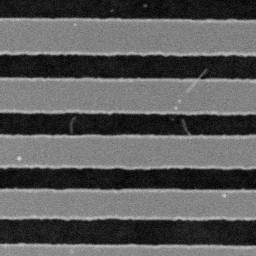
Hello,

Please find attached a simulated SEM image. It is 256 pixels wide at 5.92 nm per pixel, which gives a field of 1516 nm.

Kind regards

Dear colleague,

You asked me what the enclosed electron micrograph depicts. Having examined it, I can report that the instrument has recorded lines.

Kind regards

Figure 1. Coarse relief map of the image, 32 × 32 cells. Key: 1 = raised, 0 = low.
00000000000000000000000000000000
00000000000000000000000000000000
11111111111111111111111100000100
11111111111111111111111111111111
11111111111111111111111111111111
11111111111111111111111111111111
11111111111111111111111111111111
00000000000000000000000000000000
00000000000000000000000000000000
00000000000000000000000000000000
11111111111111111111111111111111
11111111111111111111111111111111
11111111111111111111111111111111
11111111111111111111111111111111
00000000000000000000000000000000
00000000000000000000000000000000
00000000000000000000000000000000
11111111111111111111111111111111
11111111111111111111111111111111
11111111111111111111111111111111
11111111111111111111111111111111
00000000000000000000000000000000
00000000000000000000000000000000
00000000000000000000000000000000
11111111111111111111111111111111
11111111111111111111111111111111
11111111111111111111111111111111
00000000000100000000000110000111
00000000000000000000000000000000
00000000000000000000000000000000
00000000000000000000000000000000
11111111111111111111111111111111